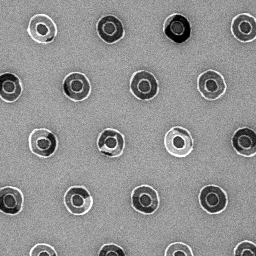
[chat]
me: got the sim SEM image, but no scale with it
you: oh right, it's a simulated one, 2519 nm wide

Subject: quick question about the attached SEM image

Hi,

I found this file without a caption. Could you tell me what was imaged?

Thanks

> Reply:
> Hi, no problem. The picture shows a regular array of ring-shaped raised bodies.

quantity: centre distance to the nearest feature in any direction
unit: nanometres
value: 643